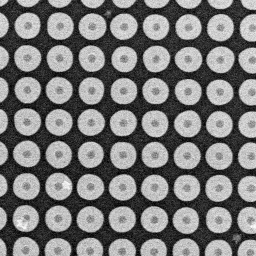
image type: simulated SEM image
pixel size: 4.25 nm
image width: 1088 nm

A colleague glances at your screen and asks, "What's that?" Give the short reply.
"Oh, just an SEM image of an array of small figures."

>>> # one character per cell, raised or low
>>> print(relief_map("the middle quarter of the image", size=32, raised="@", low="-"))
@@--@@@@@@--@@@@@@--@@@@@@--@@@@
@----@@@@----@@@@----@@@@-----@@
--------------------------------
------@-------------------------
@---@@@@@----@@@@---@@@@@----@@@
@@--@@@@@@--@@@@@@--@@@@@@--@@@@
@@--@@@@@@--@@@@@@--@@@@@@--@@@@
@@--@@@@@@--@@@@@@--@@@@@@--@@@@
@---@@@@@---@@@@@@--@@@@@@--@@@@
-----@@@@----@@@@----@@@@----@@@
--------------------------------
------@@------------------------
@---@@@@@----@@@@---@@@@@----@@@
@@--@@@@@@--@@@@@@--@@@@@@--@@@@
@@--@@@@@@--@@@@@@--@@@@@@--@@@@
@@--@@@@@@--@@@@@@--@@@@@@--@@@@
@---@@@@@---@@@@@@--@@@@@@--@@@@
-----@@@-----@@@@----@@@@----@@@
--------------------------------
--------------------------------
@---@@@@@---@@@@@---@@@@@----@@@
@@--@@@@@@--@@@@@@--@@@@@@--@@@@
@@--@@@@@@--@@@@@@--@@@@@@-@@@@@
@@--@@@@@@--@@@@@@--@@@@@@-@@@@@
@---@@@@@---@@@@@@--@@@@@@--@@@@
-----@@@-----@@@@----@@@----@@@@
--------------------------------
--------------------------------
@---@@@@@----@@@@---@@@@@---@@@@
@@-@@@@@@@--@@@@@@--@@@@@@--@@@@
@@-@@@@@@@-@@@@@@@-@@@@@@@--@@@@
@@-@@@@@@@-@@@@@@@-@@@@@@@--@@@@